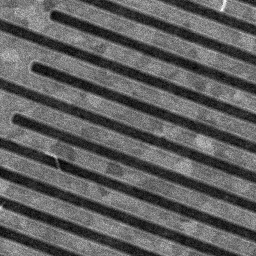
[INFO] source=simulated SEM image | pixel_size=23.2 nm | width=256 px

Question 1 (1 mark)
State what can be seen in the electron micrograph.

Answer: parallel lines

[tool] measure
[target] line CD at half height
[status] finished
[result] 15.9 pixels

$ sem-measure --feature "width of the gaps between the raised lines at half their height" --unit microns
0.262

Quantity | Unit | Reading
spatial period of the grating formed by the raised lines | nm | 642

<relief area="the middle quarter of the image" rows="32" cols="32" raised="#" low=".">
#######.........############....
##########.........###########..
.############.........##########
....############........########
.......###########.........#####
#.........###########.........##
####........############........
#######........############.....
##########........###########...
.###########.........###########
....###########........#########
......###########.........######
.........###########.........###
###.........###########........#
######........############......
########.........############...
###########.........###########.
..############.........#########
.....###########..........######
........###########.........####
##........#############........#
#####........############.......
########........############....
##########.........###########..
.############........###########
....############........########
.......###########.........#####
#........############........###
####........############........
######.........###########......
#########.........###########...
############.........###########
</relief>